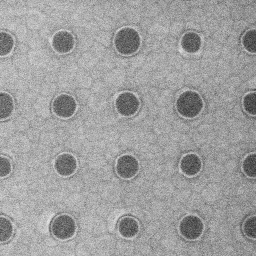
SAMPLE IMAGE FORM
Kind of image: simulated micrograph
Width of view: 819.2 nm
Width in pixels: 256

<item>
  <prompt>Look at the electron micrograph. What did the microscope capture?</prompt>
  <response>a regular array of raised bodies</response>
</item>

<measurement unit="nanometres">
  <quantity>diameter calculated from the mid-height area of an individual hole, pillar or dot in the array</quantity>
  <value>82.8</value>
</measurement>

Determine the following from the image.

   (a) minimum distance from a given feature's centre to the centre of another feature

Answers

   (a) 196 nanometers